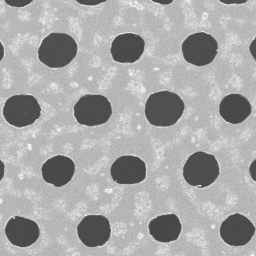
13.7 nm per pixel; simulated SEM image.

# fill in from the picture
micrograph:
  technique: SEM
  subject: a regular array of holes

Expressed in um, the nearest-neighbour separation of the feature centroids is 0.956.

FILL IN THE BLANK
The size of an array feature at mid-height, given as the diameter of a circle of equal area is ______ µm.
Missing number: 0.453